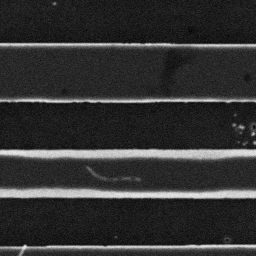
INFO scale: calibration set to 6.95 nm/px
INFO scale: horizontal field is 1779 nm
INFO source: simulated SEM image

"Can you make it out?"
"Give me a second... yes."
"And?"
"lines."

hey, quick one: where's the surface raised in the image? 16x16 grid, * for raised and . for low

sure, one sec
................
................
................
****************
****************
****************
................
................
................
*...............
****************
****************
................
................
................
****************